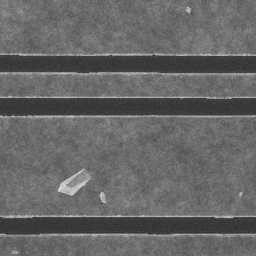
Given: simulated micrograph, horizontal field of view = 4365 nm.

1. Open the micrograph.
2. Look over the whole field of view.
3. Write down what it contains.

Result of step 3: lines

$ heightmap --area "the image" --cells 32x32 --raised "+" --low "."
++++++++++++++++++++++++++++++++
++++++++++++++++++++++++++++++++
++++++++++++++++++++++++++++++++
++++++++++++++++++++++++++++++++
++++++++++++++++++++++++++++++++
++++++++++++++++++++++++++++++++
++++++++++++++++++++++++++++++++
................................
................................
++++++++++++++++++++++++++++++++
++++++++++++++++++++++++++++++++
++++++++++++++++++++++++++++++++
................................
................................
................................
++++++++++++++++++++++++++++++++
++++++++++++++++++++++++++++++++
++++++++++++++++++++++++++++++++
++++++++++++++++++++++++++++++++
++++++++++++++++++++++++++++++++
++++++++++++++++++++++++++++++++
++++++++++++++++++++++++++++++++
++++++++++++++++++++++++++++++++
++++++++++++++++++++++++++++++++
++++++++++++++++++++++++++++++++
++++++++++++++++++++++++++++++++
++++++++++++++++++++++++++++++++
................................
................................
++++++++++++++++++++++++++++++++
++++++++++++++++++++++++++++++++
++++++++++++++++++++++++++++++++